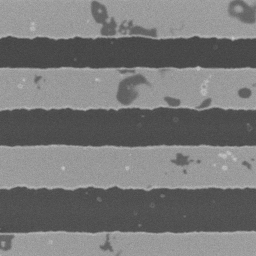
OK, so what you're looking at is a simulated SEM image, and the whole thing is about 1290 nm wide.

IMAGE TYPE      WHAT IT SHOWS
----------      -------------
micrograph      lines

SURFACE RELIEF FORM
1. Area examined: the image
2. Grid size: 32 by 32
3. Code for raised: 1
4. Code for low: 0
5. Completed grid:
11111111111111111111111111111111
11111111111111111111111111111111
11111111111111111111111111111111
11111111111111111111111111111111
11111111111111111111111111111111
00000000000000000000000000000000
00000000000000000000000000000000
00000000000000000000000000000000
00000001110000000100000010000000
11111111111111111111111111111111
11111111111111111111111111111111
11111111111111111111111111111111
11111111111111111111111111111111
11111111111111111111011111111111
00000000000000000000000000000000
00000000000000000000000000000000
00000000000000000000000000000000
00000000000000000000000000000000
11111111111111111111111111111111
11111111111111111111111111111111
11111111111111111111111111111111
11111111111111111111111111111111
11111111111111111111111111111111
10001011110001011111011110011110
00000000000000000000000000000000
00000000000000000000000000000000
00000000000000000000000000000000
00000000000000000000000000000000
00000000000000000000000000000000
11111111111111111111111111111111
11111111111111111111111111111111
11111111111111111111111111111111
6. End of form